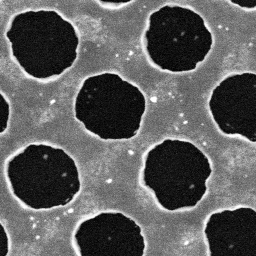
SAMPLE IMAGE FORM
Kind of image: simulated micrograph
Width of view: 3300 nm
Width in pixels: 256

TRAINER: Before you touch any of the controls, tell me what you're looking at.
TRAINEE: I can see holes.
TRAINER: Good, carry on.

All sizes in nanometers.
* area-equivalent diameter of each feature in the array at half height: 887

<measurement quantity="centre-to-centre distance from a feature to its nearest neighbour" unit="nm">1220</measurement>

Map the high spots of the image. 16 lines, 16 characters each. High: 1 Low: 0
1111111111001110
1000111110000111
1000011110000111
1000011110000111
1100111111111111
1111100001111100
1111100001111000
1111100001111000
1111110011111110
1000111110000111
0000011110000111
1000011110000111
1000111111001111
1111110011111000
1111100001111000
1111100001111000